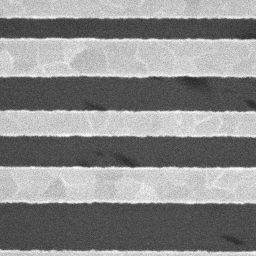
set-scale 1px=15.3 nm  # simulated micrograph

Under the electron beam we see lines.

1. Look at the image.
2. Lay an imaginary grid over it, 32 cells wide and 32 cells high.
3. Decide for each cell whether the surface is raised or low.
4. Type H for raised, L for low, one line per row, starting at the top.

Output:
HHHHHHHHHHHHHHHHHHHHHHHHHHHHHHHH
HHHHHHHHHHHHHHHHHHHHHHHHHHHHHHHH
LLLLLLLLLLLLLLLLLLLLLLLLLLLLLLLL
LLLLLLLLLLLLLLLLLLLLLLLLLLLLLLLL
LLLLLLLLLLLLLLLLLLLLLLLLLLLLLLLL
HHHHHHHHHHHHHHHHHHHHHHHHHHHHHHHH
HHHHHHHHHHHHHHHHHHHHHHHHHHHHHHHH
HHHHHHHHHHHHHHHHHHHHHHHHHHHHHHHH
HHHHHHHHHHHHHHHHHHHHHHHHHHHHHHHH
LHLLLHLLLLLLLLLHHHHHLLLLLLLLLHHH
LLLLLLLLLLLLLLLLLLLLLLLLLLLLLLLL
LLLLLLLLLLLLLLLLLLLLLLLLLLLLLLLL
LLLLLLLLLLLLLLLLLLLLLLLLLLLLLLLL
LLLLLLLLLLLLLLLLLLLLLLLLLLLLLLLL
HHHHHHHHHHHHHHHHHHHHHHHHHHHHHHHH
HHHHHHHHHHHHHHHHHHHHHHHHHHHHHHHH
HHHHHHHHHHHHHHHHHHHHHHHHHHHHHHHH
LLLLLLLLLLLLLLLLLLLLLLLLLLLLLLLL
LLLLLLLLLLLLLLLLLLLLLLLLLLLLLLLL
LLLLLLLLLLLLLLLLLLLLLLLLLLLLLLLL
LLLLLLLLLLLLLLLLLLLLLLLLLLLLLLLL
HHHHHHHHHHHHHHHHHHHHHHHHHHHHHHHH
HHHHHHHHHHHHHHHHHHHHHHHHHHHHHHHH
HHHHHHHHHHHHHHHHHHHHHHHHHHHHHHHH
HHHHHHHHHHHHHHHHHHHHHHHHHHHHHHHH
LLLLLLLLLLLLLLLLLLLLLLLLLLLLLLLL
LLLLLLLLLLLLLLLLLLLLLLLLLLLLLLLL
LLLLLLLLLLLLLLLLLLLLLLLLLLLLLLLL
LLLLLLLLLLLLLLLLLLLLLLLLLLLLLLLL
LLLLLLLLLLLLLLLLLLLLLLLLLLLLLLLL
LLLLLLLLLLLLLLLLLLLLLLLLLLLLLLLL
HHHHHHHHHHHHHHHHHHHLHHHHHHLLLLLL